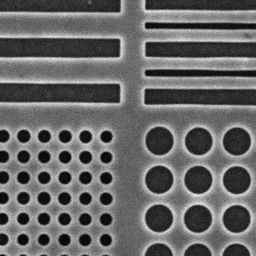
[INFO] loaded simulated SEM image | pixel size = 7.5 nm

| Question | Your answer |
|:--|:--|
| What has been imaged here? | groups of lines, slits or small figures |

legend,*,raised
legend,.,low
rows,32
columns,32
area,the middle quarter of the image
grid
********************************
*********************...........
********************............
********************************
********************************
..............******************
..............******............
..............******............
..............******............
..............******............
********************************
********************************
********************************
********************************
********************************
***********************.********
.****.****************....*****.
..**...**...*********......****.
..**...**...********.......***..
.***..****..********........**..
*********************......***..
*********************......****.
..**...**...**********...*******
..**...**...********************
.***...**...********************
***********************..*******
*********************.....*****.
..**...**...********.......***..
..**...**...********.......***..
.***...**...********.......***..
*********************......***..
*********************.....*****.